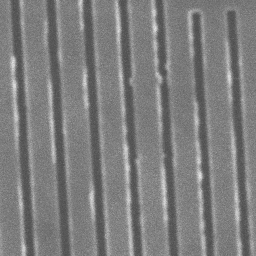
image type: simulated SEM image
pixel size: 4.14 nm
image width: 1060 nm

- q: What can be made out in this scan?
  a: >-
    parallel lines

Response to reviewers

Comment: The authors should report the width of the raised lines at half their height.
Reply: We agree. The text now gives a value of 110 nanometers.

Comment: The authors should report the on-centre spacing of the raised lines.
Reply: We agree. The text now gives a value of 149 nm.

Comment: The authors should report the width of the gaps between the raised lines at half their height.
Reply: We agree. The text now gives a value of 39.8 nanometres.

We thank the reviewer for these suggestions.